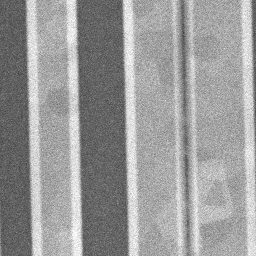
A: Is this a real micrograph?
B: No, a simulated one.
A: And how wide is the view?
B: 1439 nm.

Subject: one or a few lines or trenches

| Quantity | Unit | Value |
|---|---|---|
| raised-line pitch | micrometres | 0.466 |